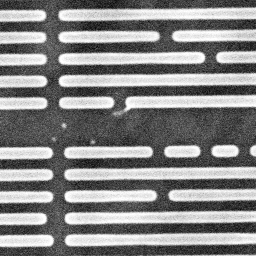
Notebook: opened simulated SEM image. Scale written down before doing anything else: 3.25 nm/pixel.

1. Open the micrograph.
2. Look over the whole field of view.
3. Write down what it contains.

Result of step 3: groups of lines, slits or small figures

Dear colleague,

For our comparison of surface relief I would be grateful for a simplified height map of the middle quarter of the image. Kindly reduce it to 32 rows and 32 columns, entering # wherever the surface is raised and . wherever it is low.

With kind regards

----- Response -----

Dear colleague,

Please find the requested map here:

................................
................................
................................
################################
################################
................................
................................
................................
........###.....################
############....################
############....################
................................
................................
................................
................................
................................
................................
................................
................................
................................
................................
.#####################....######
######################....######
................................
................................
................................
.###############################
################################
.############.......#########...
................................
................................
................................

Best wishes